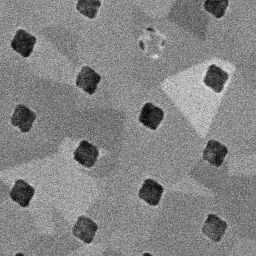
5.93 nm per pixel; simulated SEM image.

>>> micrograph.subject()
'a regular array of holes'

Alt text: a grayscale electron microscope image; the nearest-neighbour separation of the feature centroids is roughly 431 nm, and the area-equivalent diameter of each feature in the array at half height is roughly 0.153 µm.